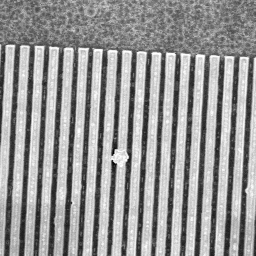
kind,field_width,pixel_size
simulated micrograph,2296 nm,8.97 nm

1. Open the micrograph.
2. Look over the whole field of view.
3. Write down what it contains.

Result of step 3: parallel lines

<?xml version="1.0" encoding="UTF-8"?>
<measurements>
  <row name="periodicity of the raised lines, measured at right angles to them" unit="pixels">14.6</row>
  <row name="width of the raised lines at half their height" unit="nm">69.4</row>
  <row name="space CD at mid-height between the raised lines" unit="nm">60.4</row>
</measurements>